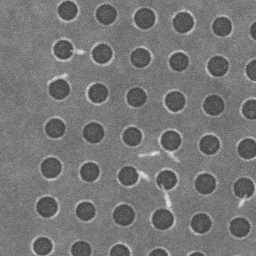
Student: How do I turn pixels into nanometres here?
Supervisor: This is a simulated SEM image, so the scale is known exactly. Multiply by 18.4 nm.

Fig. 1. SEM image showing a regular array of holes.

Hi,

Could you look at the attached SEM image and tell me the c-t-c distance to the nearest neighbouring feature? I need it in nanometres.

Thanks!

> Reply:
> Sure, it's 714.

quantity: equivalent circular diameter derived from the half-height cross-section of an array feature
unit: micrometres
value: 0.401